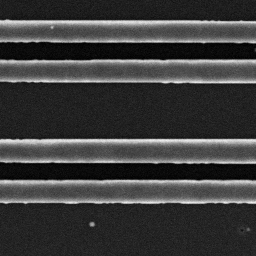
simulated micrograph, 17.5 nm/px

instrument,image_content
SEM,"lines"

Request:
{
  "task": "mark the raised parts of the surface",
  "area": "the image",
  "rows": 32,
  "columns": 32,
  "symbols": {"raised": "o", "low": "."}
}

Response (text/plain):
................................
................................
................................
oooooooooooooooooooooooooooooooo
oooooooooooooooooooooooooooooooo
................................
................................
oo..o...o..ooooooooooooooooooooo
oooooooooooooooooooooooooooooooo
oooooooooooooooooooooooooooooooo
................................
................................
................................
................................
................................
................................
................................
......oooooooooooooooooooooooooo
oooooooooooooooooooooooooooooooo
oooooooooooooooooooooooooooooooo
................................
................................
................................
oooooooooooooooooooooooooooooooo
oooooooooooooooooooooooooooooooo
................................
................................
................................
................................
................................
................................
................................